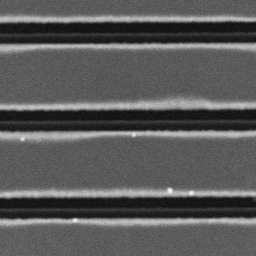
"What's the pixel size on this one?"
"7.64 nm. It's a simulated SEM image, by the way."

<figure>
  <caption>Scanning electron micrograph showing lines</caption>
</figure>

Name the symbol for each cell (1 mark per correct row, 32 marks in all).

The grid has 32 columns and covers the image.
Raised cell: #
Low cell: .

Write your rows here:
################################
################################
################################
................................
................................
.......................##.#..#..
################################
################################
################################
################################
################################
################################
################################
#####################....######.
................................
................................
...........#####################
################################
################################
################################
################################
################################
################################
################################
##########.#.#..#...............
................................
................................
################################
################################
################################
################################
################################